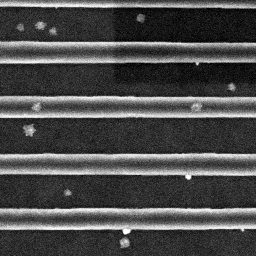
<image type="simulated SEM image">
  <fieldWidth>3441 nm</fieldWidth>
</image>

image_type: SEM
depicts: lines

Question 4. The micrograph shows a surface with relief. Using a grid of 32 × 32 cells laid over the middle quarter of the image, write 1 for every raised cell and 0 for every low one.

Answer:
00000000000000000000000000000000
00000000000000000000000000000000
00000000000000000000000000000000
00000000000000000000000000000000
00000000000000000000000000000000
00000000000000000000000000000000
00000000000000000000000000000000
00000000000000000000000000000000
11111111111111011000000000000000
11111111111111111111111111111111
11111111111111111111111111111111
11111111111111111111111111111111
11111111111111111111111111111111
00000000000000000000000000000000
00000000000000000000000000000000
00000000000000000000000000000000
00000000000000000000000000000000
00000000000000000000000000000000
00000000000000000000000000000000
00000000000000000000000000000000
00000000000000000000000000000000
00000000000000000000000000000000
00000000000000000000000000000000
11111111111111111111111111111111
11111111111111111111111111111111
11111111111111111111111111111111
11111111111111111111111111111111
00000000000000000000000000000000
00000000000000000000000000000000
00000000000000000000000000000000
00000000000000000000000000000000
00000000000000000000000000000000